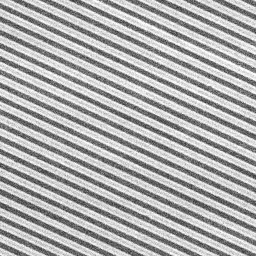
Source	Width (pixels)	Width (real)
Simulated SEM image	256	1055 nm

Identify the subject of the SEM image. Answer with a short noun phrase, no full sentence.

parallel lines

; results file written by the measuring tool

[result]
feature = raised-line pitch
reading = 49.7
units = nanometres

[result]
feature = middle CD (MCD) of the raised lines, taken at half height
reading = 24.4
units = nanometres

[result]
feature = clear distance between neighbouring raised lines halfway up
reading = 0.0244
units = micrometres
